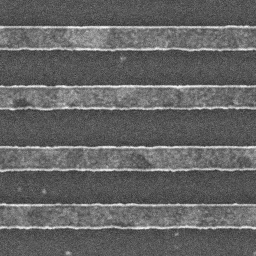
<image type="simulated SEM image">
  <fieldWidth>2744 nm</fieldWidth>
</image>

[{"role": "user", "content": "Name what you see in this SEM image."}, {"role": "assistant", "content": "lines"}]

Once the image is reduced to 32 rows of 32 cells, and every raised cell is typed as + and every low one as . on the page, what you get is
................................
................................
................................
++++++++++++++++++++++++++++++++
++++++++++++++++++++++++++++++++
++++++++++++++++++++++++++++++++
................................
................................
................................
................................
................................
++++++++++++++++++++++++++++++++
++++++++++++++++++++++++++++++++
+++++++++++++++++++++++++++.+..+
................................
................................
................................
................................
++++++++++++++++++++++++++++++++
++++++++++++++++++++++++++++++++
++++++++++++++++++++++++++++++++
................................
................................
................................
................................
................................
++++++++++++++++++++++++++++++++
++++++++++++++++++++++++++++++++
+.++.++..++++..++++.++..++.....+
................................
................................
................................